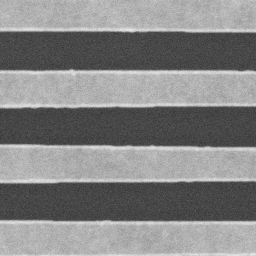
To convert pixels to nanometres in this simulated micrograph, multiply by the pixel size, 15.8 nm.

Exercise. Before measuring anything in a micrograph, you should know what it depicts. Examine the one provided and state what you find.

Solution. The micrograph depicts lines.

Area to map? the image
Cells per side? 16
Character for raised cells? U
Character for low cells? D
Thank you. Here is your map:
UUUUUUUUUUUUUUUU
UUUUUUUUUUUUUUUU
DDDDDDDDDDDDDDDD
DDDDDDDDDDDDDDDD
UUUUUUUUUUUUUUUU
UUUUUUUUUUUUUUUU
UUUUUUUUUUUUUUUU
DDDDDDDDDDDDDDDD
DDDDDDDDDDDDDDDD
UUUUUUUUUUUUUUUU
UUUUUUUUUUUUUUUU
DDDDDDDDDDDDDDDD
DDDDDDDDDDDDDDDD
DDDDDDDDDDDDDDDD
UUUUUUUUUUUUUUUU
UUUUUUUUUUUUUUUU